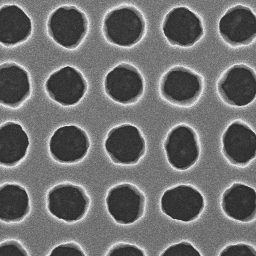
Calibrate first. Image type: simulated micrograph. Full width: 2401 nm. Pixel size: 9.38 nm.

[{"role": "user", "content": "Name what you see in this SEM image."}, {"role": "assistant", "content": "a regular array of holes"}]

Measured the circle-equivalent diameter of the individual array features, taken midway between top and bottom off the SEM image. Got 37.7 px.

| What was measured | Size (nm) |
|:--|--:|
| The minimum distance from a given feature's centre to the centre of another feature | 532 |